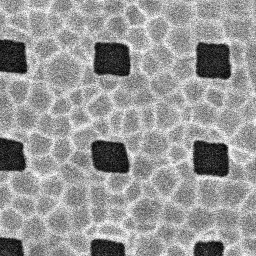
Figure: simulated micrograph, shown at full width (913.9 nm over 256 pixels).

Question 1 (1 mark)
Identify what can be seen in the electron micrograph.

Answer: holes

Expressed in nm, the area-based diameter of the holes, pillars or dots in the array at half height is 139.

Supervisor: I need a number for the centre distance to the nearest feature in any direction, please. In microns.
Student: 0.35